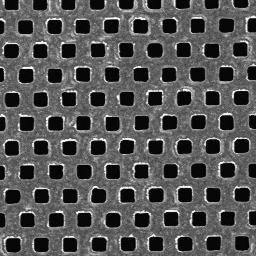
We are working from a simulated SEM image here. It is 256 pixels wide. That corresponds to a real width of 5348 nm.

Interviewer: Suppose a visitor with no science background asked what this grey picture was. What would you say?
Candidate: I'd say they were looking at a regular array of holes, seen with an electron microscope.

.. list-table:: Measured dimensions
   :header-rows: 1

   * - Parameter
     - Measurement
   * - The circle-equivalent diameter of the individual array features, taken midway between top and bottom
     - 330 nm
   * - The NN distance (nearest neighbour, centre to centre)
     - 27.7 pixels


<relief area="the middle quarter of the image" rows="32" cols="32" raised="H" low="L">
HHHHHHHHHHHHHHHHHHHHHHHHHHHHHHHH
HHHLLLLHHHLLLLHHHLLLLHHHHLLLHHHL
HHHLLLLHHHLLLLHHHLLLLHHHHLLLHHHL
HHHLLLLHHHLLLLHHHLLLLHHHLLLLHHHH
HHHHLLHHHHHHHHHHHHHHHHHHHLLHHHHH
HHHHHHHHHHHHHHHHHHHHHHHHHHHHHHHH
HHHHHHHHHHHHHHHHHHHHHHHHHHHHHHHH
LLLHHHHLLLHHHHLLLLHHHLLLLHHHLLLL
LLLHHHLLLLHHHHLLLLHHHLLLLHHHLLLL
LLLHHHLLLLHHHHLLLLHHHLLLLHHHLLLL
LLLHHHHHLLHHHHHHLHHHHHLHHHHHHLHH
HHHHHHHHHHHHHHHHHHHHHHHHHHHHHHHH
HHHHHHHHHHHHHHHHHHHHHHHHHHHHHHHH
HHHLLLHHHHHLLLHHHHLLLHHHHLLLHHHH
HHHLLLLHHHLLLLHHHHLLLHHHLLLLHHHH
HHHLLLLHHHLLLLHHHHLLLHHHLLLLHHHH
HHHLLLHHHHHLLHHHHHLLHHHHHLLLHHHH
HHHHHHHHHHHHHHHHHHHHHHHHHHHHHHHH
HHHHHHHHHHHHHHHHHHHHHHHHHHHHHHHH
LLLHHHHLLLHHHHLLLHHHHLLLLHHHLLLL
LLLHHHHLLLLHHHLLLLHHHLLLLHHHLLLL
LLLHHHHLLLLHHHLLLHHHHLLLLHHHLLLL
LLLHHHHLLLHHHHHLHHHHHHLLHHHHHHHH
HHHHHHHHHHHHHHHHHHHHHHHHHHHHHHHH
HHHHHHHHHHHHHHHHHHHHHHHHHHHHHHHH
HHHLLLLHHHHLLLHHHHLLLHHHHLLLHHHH
HHHLLLLHHHLLLLHHHHLLLHHHHLLLLHHH
HHHLLLLHHHLLLLHHHLLLLHHHHLLLLHHH
HHHHLLHHHHHLLLHHHHLLLHHHHLLHHHHH
HHHHHHHHHHHHHHHHHHHHHHHHHHHHHHHH
HHHHHHHHHHHHHHHHHHHHHHHHHHHHHHHH
LLLHHHHLLLHHHHLLLHHHHLLLLHHHHLLL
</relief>